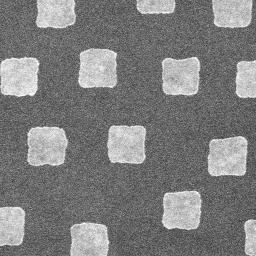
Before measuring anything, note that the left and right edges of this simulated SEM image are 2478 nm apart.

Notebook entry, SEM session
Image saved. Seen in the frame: raised bodies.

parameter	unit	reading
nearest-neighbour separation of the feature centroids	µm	0.724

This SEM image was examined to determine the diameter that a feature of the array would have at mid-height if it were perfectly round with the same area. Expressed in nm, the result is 394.